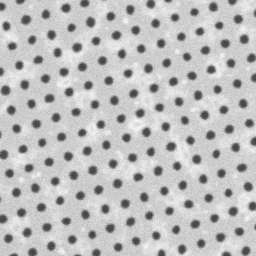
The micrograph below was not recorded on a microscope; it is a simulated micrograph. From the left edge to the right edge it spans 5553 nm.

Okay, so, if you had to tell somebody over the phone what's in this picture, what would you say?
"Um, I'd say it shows a regular array of holes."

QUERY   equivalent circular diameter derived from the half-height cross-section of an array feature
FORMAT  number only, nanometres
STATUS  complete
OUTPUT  206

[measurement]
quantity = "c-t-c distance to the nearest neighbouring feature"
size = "428 nm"